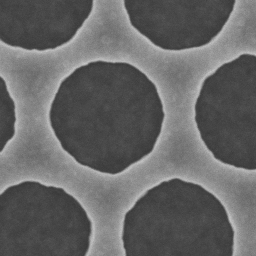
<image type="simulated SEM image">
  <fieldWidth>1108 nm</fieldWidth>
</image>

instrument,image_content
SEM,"holes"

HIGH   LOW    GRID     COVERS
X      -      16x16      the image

------XX-------X
-----XXX------XX
----XXXXX----XXX
XXXXXXXXXXXXXXX-
XXXXX----XXXX---
XXXX------XXX---
-XX-------XX----
-XX-------XX----
-XXX------XXX---
XXXX-----XXXX---
XXXXXX--XXXXXXX-
X--XXXXXXX--XXXX
-----XXXX-----XX
-----XXX------XX
------XX-------X
------XX-------X